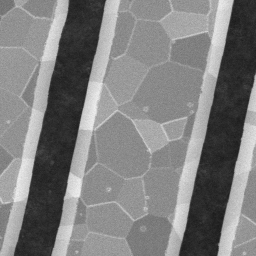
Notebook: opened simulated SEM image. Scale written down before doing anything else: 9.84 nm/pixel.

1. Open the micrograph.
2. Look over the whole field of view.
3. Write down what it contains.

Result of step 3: one or a few lines or trenches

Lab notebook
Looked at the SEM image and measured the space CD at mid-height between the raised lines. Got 477 nanometres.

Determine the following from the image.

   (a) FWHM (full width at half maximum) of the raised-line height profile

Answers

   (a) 1.1 µm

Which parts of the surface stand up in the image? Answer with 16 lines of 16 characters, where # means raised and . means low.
####...#######..
####...#######..
###....#######..
###...########..
###...#######...
###...#######...
###...#######...
##...########...
##...#######....
##...#######...#
##...#######...#
#....#######...#
#...########...#
#...#######...##
#...#######...##
#...#######...##